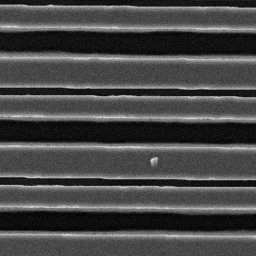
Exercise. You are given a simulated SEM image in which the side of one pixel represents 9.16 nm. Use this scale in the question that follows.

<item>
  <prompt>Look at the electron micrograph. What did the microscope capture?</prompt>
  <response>lines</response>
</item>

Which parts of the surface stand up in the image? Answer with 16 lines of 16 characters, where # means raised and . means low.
################
################
................
................
################
################
################
................
................
################
################
################
################
................
................
################